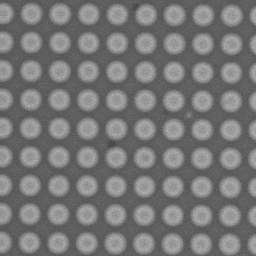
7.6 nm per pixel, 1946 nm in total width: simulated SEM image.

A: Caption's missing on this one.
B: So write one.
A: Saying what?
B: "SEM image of an array of small figures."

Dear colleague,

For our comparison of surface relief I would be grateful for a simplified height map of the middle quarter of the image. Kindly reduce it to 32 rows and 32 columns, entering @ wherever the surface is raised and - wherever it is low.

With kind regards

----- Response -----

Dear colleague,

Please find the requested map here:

@---@@@@---@@@@@--@@@@@--@@@@@--
@--@@@@@@--@@@@@--@@@@@--@@@@@--
@--@@@@@@--@@@@@--@@@@@--@@@@@--
@---@@@@---@@@@---@@@@@--@@@@@--
------------@@-----@@@----@@----
--------------------------------
-----@@-------------@-----------
@---@@@@---@@@@---@@@@@--@@@@---
@--@@@@@@--@@@@@--@@@@@--@@@@@--
@--@@@@@@--@@@@@--@@@@@--@@@@@--
@---@@@@---@@@@---@@@@@--@@@@@--
-----@@-----@@-----@@@----@@@---
--------------------------------
--------------------------------
@---@@@@---@@@@---@@@@----@@@---
@--@@@@@@--@@@@@--@@@@@--@@@@@--
@--@@@@@@--@@@@@--@@@@@--@@@@@--
@---@@@@---@@@@---@@@@@--@@@@@--
-----@@-----@@-----@@@----@@@---
--------------------------------
--------------------------------
@---@@@@---@@@@---@@@@----@@@---
@--@@@@@--@@@@@@--@@@@@--@@@@@--
@--@@@@@--@@@@@@--@@@@@--@@@@@--
@--@@@@@---@@@@---@@@@@--@@@@@--
----@@@----@@@@---@@@@----@@@---
--------------------------------
--------------------------------
@---@@@@---@@@@----@@@----@@@---
@--@@@@@---@@@@---@@@@---@@@@@--
@--@@@@@--@@@@@---@@@@@--@@@@@--
@--@@@@@---@@@@---@@@@@--@@@@@--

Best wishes